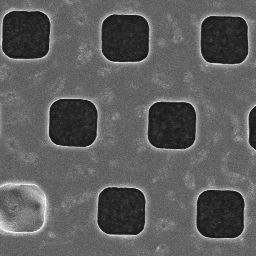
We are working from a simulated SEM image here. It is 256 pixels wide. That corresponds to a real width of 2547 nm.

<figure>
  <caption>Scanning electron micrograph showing holes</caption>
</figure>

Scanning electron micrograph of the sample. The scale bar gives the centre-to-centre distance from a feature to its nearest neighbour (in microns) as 0.984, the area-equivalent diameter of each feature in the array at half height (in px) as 51.9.